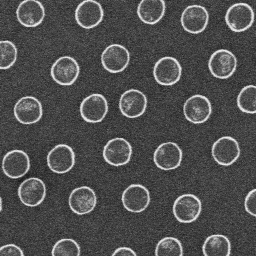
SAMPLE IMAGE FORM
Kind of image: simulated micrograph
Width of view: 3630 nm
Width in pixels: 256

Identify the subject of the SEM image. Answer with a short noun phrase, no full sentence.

a regular array of raised bodies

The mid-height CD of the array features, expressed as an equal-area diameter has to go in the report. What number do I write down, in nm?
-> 379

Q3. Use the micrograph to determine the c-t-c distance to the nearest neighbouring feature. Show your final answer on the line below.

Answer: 673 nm